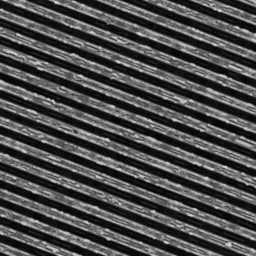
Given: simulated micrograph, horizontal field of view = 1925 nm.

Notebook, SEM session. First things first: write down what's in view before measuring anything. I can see parallel lines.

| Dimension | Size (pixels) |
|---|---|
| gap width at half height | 7.71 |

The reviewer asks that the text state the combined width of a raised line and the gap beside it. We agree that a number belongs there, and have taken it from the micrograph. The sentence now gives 126 nanometers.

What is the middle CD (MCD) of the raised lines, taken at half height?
71.1 nm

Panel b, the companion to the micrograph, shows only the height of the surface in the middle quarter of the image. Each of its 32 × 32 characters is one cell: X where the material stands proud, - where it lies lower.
---XXXXXXX-----XXXXXXX-----XXXXX
X------XXXXXX-----XXXXXXX-----XX
XXXX-----XXXXXX------XXXXXX-----
XXXXXX-----XXXXXXX-----XXXXXXX--
--XXXXXXX-----XXXXXX------XXXXXX
-----XXXXXXX-----XXXXXX-----XXXX
XX------XXXXXX------XXXXXX-----X
XXXXX-----XXXXXXX-----XXXXXX----
-XXXXXX------XXXXXX-----XXXXXXX-
----XXXXXX------XXXXX------XXXXX
X-----XXXXXXX-----XXXXXX------XX
XXXX-----XXXXXX------XXXXXX-----
XXXXXX-----XXXXXXX-----XXXXXX---
---XXXXXX-----XXXXXXX-----XXXXXX
-----XXXXXXX-----XXXXXX------XXX
XX------XXXXXX-----XXXXXXX-----X
XXXXX-----XXXXXXX-----XXXXXX----
-XXXXXXX-----XXXXXXX-----XXXXXX-
----XXXXXX------XXXXXX-----XXXXX
X-----XXXXXXX-----XXXXXXX-----XX
XXX------XXXXXX------XXXXXX-----
XXXXXX------XXXXXX------XXXXXX--
--XXXXXXX-----XXXXXXX-----XXXXXX
-----XXXXXX------XXXXXX------XXX
XX-----XXXXXXX-----XXXXXXX-----X
XXXXX-----XXXXXXX-----XXXXXXX---
-XXXXXX------XXXXXX------XXXXXX-
----XXXXXX-----XXXXXXX-----XXXXX
X------XXXXX------XXXXXX------XX
XXXX-----XXXXXX------XXXXXX-----
XXXXXX------XXXXXX-----XXXXXXX--
--XXXXXXX-----XXXXXX------XXXXXX